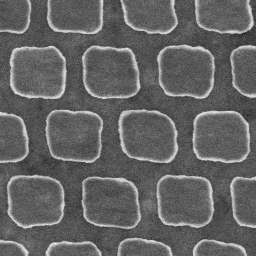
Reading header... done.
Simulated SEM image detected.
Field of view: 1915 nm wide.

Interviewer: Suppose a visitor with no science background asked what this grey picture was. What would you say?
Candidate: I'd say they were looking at a regular array of raised bodies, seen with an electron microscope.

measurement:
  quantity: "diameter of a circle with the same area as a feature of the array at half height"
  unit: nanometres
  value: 428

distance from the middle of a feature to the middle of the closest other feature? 0.547 micrometres